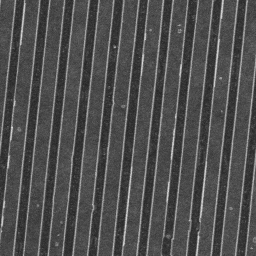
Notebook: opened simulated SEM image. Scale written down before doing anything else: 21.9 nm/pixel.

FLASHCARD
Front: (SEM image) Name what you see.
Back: parallel lines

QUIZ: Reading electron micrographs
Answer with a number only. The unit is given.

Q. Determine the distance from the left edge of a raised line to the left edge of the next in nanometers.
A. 537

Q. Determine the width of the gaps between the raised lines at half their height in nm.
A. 318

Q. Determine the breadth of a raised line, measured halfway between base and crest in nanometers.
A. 212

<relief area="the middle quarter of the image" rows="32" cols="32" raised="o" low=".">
o....oo....oo....oo....ooo...ooo
o....oo....oo....oo....oo....ooo
.....oo....oo....oo....oo....oo.
....ooo....oo....oo....oo....oo.
....ooo...ooo....oo....oo....oo.
....oo....ooo...ooo....oo....oo.
....oo....oo....ooo....oo....oo.
....oo....oo....ooo....oo....oo.
....oo....oo....ooo...ooo....oo.
....oo....oo....ooo...ooo...ooo.
....oo....oo....oo....oo....ooo.
....oo....oo....oo....oo....oo..
....oo....oo....oo....oo....oo..
...ooo...ooo....oo....oo....oo..
...ooo...ooo...ooo....oo....oo..
...oo....ooo...ooo....oo....oo..
...oo....oo....ooo....oo....oo..
...oo....oo....ooo....oo....oo..
...oo....oo....ooo...ooo...ooo..
...oo....oo....oo....ooo...ooo..
...oo....oo....oo....oo....ooo..
..ooo....oo....oo....oo....oo...
..ooo....oo....oo....oo....oo...
..ooo...ooo....oo....oo....oo...
..ooo...ooo....oo....oo....oo...
..oo....ooo....oo....oo....oo...
..oo....oo....ooo....oo....oo...
..oo....oo....ooo...ooo....oo...
..oo....oo....ooo...ooo...ooo...
..oo....oo....oo....ooo...ooo...
..oo....oo....oo....oo....ooo...
.ooo....oo....oo....oo....oo....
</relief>